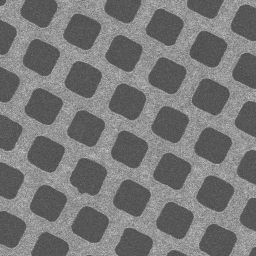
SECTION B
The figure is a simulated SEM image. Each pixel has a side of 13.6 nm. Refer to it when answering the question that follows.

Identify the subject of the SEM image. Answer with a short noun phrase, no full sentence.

a regular array of holes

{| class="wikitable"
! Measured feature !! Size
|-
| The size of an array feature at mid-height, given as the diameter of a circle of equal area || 0.475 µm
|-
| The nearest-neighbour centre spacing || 648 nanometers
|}